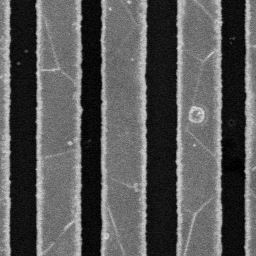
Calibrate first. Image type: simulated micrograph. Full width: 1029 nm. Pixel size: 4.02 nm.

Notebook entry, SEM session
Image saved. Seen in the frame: lines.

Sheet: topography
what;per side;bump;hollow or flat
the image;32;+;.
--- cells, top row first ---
+....+++++...+++++....++++++...+
+....+++++...+++++....++++++...+
+....+++++...+++++....++++++...+
+....+++++...+++++....++++++...+
+....+++++...+++++....++++++...+
+....+++++...+++++....++++++...+
+....+++++...+++++....++++++...+
+....+++++...+++++....++++++...+
+....+++++...+++++....++++++...+
+....+++++...+++++....++++++...+
+....+++++...+++++....++++++...+
+....+++++...+++++....++++++...+
+....+++++...+++++....++++++...+
+....+++++...+++++....++++++...+
+....+++++...+++++....++++++...+
+....+++++...+++++....++++++...+
+....+++++...+++++....++++++...+
+....+++++...+++++....++++++...+
+....+++++...+++++....++++++...+
+....+++++...+++++....++++++...+
+....+++++...+++++....++++++...+
+....+++++...+++++....++++++...+
+....+++++...+++++....++++++...+
+....+++++...+++++....++++++...+
+....+++++...+++++....++++++...+
+....+++++...+++++....++++++...+
+....+++++...+++++....++++++...+
+....+++++...+++++....++++++...+
+....+++++...+++++....++++++...+
+....+++++...+++++....++++++...+
+....+++++...+++++....++++++...+
+....+++++...+++++....++++++...+